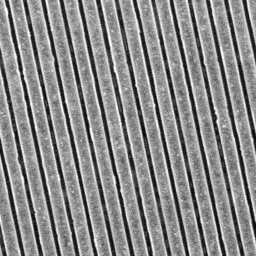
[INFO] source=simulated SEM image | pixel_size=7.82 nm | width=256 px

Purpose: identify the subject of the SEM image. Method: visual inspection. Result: parallel lines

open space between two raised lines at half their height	4.77	px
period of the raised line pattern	17.9	pixels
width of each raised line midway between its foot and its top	0.105	um